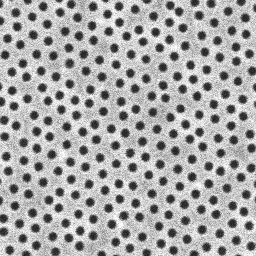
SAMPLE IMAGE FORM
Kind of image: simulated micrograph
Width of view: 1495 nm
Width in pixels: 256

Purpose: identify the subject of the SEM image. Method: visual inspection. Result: a regular array of holes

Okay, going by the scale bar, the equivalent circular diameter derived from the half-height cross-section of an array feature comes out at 52.8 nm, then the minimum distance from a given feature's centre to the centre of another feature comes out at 0.0879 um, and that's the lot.